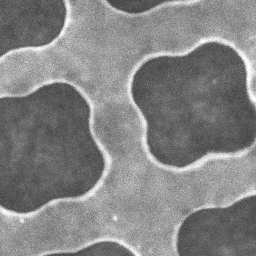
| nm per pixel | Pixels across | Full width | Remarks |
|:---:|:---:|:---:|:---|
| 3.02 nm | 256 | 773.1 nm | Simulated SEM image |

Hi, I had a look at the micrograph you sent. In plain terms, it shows holes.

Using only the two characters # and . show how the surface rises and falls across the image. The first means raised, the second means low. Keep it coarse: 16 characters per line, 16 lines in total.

....###...######
....############
...#############
##########.....#
########.......#
##...###.......#
......##........
......###.......
......###.......
......###......#
.......#########
......##########
...############.
############....
###########.....
#####...###.....